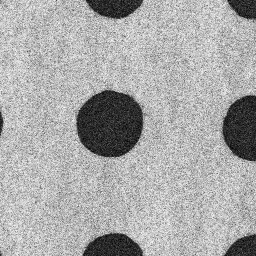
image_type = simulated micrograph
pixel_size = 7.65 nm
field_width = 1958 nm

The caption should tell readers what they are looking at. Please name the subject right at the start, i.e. holes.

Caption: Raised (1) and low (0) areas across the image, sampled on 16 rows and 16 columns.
1111110001111110
1111111111111111
1111111111111111
1111111111111111
1111111111111111
1111111111111111
1111100001111110
1111100001111100
1111100001111100
1111110011111110
1111111111111111
1111111111111111
1111111111111111
1111111111111111
1111111111111111
1111100001111100